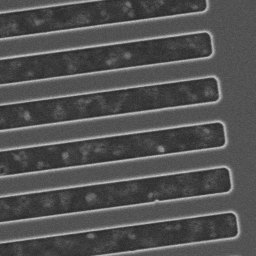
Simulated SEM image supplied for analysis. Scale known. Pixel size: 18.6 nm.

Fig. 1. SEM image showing parallel lines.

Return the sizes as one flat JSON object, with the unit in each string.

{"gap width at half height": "0.479 microns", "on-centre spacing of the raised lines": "45.6 pixels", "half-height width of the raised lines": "20.1 px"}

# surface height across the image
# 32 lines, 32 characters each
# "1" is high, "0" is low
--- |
11111111100000000000000000111111
11000000000000000000000001111111
00000000000000000011111111111111
00000000001111111111111111111111
00011111111111111111100000111111
11111111111111000000000000011111
11111110000000000000000000011111
00000000000000000000000111111111
00000000000000001111111111111111
00000000111111111111111111111111
01111111111111111111000000011111
11111111111100000000000000011111
11111000000000000000000000011111
00000000000000000000011111111111
00000000000001111111111111111111
00000011111111111111111110001111
11111111111111111000000000001111
11111111110000000000000000001111
11000000000000000000000000011111
00000000000000000001111111111111
00000000000011111111111111111111
00001111111111111111111000000111
11111111111111110000000000000111
11111111000000000000000000000111
10000000000000000000000001111111
00000000000000000011111111111111
00000000001111111111111111111111
00011111111111111111110000000011
11111111111111000000000000000011
11111110000000000000000000000111
00000000000000000000000111111111
00000000000000001111111111111111